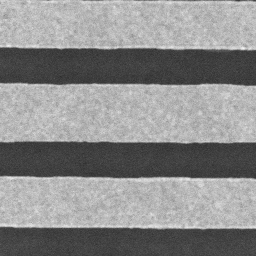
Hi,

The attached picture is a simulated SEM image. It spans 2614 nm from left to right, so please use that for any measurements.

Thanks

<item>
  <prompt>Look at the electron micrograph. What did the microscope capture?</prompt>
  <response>lines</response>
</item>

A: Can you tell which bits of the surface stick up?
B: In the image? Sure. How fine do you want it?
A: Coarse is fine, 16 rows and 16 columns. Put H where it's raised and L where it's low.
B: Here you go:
HHHHHHHHHHHHHHHH
HHHHHHHHHHHHHHHH
HHHHHHHHHHHHHHHH
LLLLLLLLLLLLLLLL
LLLLLLLLLLLLLLLL
HHHHHHHHHHHHHHHH
HHHHHHHHHHHHHHHH
HHHHHHHHHHHHHHHH
HHHHHHHHHHHHHHHH
LLLLLLLLLLLLLLLL
LLLLLLLLLLLLLLLL
HHHHHHHHHHHHHHHH
HHHHHHHHHHHHHHHH
HHHHHHHHHHHHHHHH
LLLLLLLLLLLLLLLL
LLLLLLLLLLLLLLLL